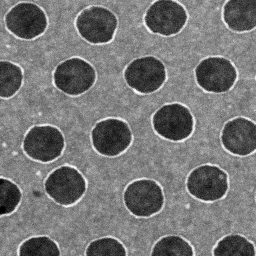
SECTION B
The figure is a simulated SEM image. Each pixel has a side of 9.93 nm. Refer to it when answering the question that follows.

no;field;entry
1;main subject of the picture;a regular array of holes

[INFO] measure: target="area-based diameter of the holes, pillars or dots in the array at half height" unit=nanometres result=392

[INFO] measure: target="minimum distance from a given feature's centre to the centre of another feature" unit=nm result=559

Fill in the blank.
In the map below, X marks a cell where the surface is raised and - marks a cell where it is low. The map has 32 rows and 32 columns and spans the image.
XX--XXXXXXXXXXXXXXX---XXXXXX----
X-----XXXX----XXXX-----XXXXX----
X-----XXXX-----XXX-----XXXXX----
X-----XXXX-----XXX-----XXXXXX---
XX---XXXXX----XXXXXXXXXXXXXXXXXX
XXXXXXXXXXXXXXXXXXXXXXXXXXXXXXXX
XXXXXXXXXXXXXXXXXXXXXXXXXXXXXXXX
XXXXXXXX--XXXXXXX---XXXXX----XXX
---XXXX-----XXXX-----XXX-----XXX
---XXXX-----XXXX-----XXX------XX
---XXXX-----XXXX----XXXXX----XXX
--XXXXXX---XXXXXX--XXXXXXX--XXXX
XXXXXXXXXXXXXXXXXXXXXXXXXXXXXXXX
XXXXXXXXXXXXXXXXXXXX---XXXXXXXXX
XXXXXXXXXXXXXXXXXXX-----XXXXXXXX
XXXXXXXXXXXX----XXX-----XXXX----
XXX-----XXXX----XXXX----XXXX----
XXX-----XXXX-----XXXX--XXXXX----
XXX-----XXXX----XXXXXXXXXXXX----
XXX----XXXXXX--XXXXXXXXXXXXXXXXX
XXXXXXXXXXXXXXXXXXXXXXXXXXXXXXXX
XXXXXX----XXXXXXXXXXXXXX----XXXX
-XXXXX-----XXXXXXX-XXXX------XXX
--XXXX-----XXXXX----XXX------XXX
---XXX----XXXXX-----XXXX----XXXX
--XXXXX--XXXXXXX----XXXXXXXXXXXX
--XXXXXXXXXXXXXX----XXXXXXXXXXXX
XXXXXXXXXXXXXXXXXXXXXXXXXXXXXXXX
XXXXXXXXXXXXXXXXXXXXXXXXXXXXXXXX
XXXXX-XXXXXXXXXXXXXXX-XXXXXX--XX
XXX----XXXX----XXXX-----XXX-----
XX-----XXXX-----XXX-----XXX-----